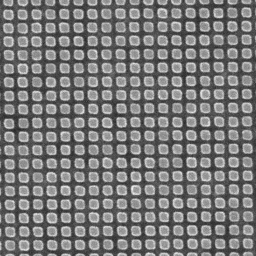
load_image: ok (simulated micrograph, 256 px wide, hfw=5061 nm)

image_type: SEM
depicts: a regular array of raised bodies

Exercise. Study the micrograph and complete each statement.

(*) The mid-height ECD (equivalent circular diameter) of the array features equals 197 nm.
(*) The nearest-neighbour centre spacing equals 0.265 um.